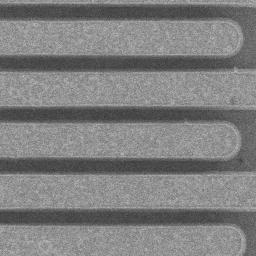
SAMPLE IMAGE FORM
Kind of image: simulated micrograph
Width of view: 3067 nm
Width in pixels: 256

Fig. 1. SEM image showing parallel lines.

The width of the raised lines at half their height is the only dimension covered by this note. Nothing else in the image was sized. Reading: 433 nm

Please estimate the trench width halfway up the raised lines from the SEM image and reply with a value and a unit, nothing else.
178 nm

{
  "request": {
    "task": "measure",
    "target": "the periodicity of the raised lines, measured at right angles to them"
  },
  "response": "614 nanometres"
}